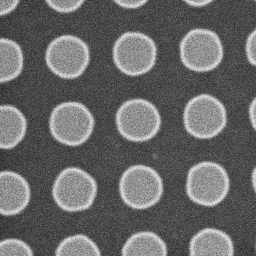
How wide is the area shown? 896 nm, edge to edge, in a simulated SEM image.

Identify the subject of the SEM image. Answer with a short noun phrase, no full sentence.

an array of small figures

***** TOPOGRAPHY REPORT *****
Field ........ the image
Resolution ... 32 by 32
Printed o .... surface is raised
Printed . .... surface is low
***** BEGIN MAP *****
oo....oooo.....ooo......oo......
o...............................
................................
................................
...............ooo.....oooo....o
oo....ooooo...ooooo....ooooo...o
ooo...ooooo...ooooo....ooooo...o
ooo...ooooo...ooooo....ooooo...o
ooo...ooooo....oooo.....ooo.....
oo......oo......................
................................
................................
........................ooo.....
oo.....oooo....oooo....ooooo...o
ooo...ooooo....ooooo...ooooo...o
ooo...oooooo...ooooo...ooooo....
ooo...ooooo....oooo.....ooo.....
oo.....oooo.....oo..............
................................
................................
.........................oo.....
........oo......ooo.....oooo....
ooo....ooooo...ooooo...oooooo...
oooo...ooooo...ooooo...ooooo....
oooo...ooooo...ooooo....oooo....
ooo....oooo.....ooo......oo.....
oo..............................
................................
................................
.........o.......ooo....oooo....
ooo.....oooo....oooo....ooooo...
oooo...ooooo...oooooo...ooooo...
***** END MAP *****